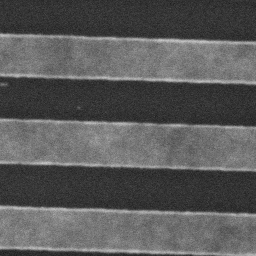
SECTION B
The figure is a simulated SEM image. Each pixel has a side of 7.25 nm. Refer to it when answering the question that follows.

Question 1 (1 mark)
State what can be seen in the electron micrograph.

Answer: lines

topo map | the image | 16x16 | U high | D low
DDDDDDDDDDDDDDDD
DDDDDDDDDDDDDDDD
UUUUUUUUUUUDDDDD
UUUUUUUUUUUUUUUU
UUUUUUUUUUUUUUUU
DDDDDDDDDDDDDDDD
DDDDDDDDDDDDDDDD
UDDDDDDDDDDDDDDD
UUUUUUUUUUUUUUUU
UUUUUUUUUUUUUUUU
DDDDDDDDDDUUUUUU
DDDDDDDDDDDDDDDD
DDDDDDDDDDDDDDDD
UUUUUUUUUUUUUUUU
UUUUUUUUUUUUUUUU
UUUUUUUUUUUUUUUU